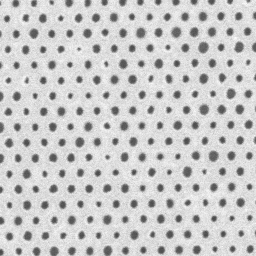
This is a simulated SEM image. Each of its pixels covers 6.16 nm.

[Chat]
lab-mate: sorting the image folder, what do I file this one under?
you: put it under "a regular array of holes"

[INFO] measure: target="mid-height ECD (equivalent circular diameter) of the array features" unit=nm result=47.2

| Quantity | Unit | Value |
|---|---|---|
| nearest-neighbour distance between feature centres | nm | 108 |